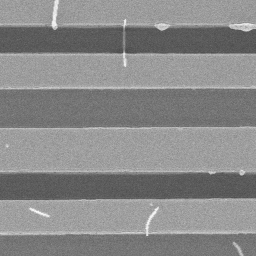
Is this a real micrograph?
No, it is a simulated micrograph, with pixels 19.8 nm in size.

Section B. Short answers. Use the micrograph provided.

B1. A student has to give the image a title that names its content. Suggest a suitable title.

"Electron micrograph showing lines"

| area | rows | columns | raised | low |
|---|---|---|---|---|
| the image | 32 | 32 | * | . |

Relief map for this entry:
********************************
********************************
********************************
....................*........***
................................
................................
................................
********************************
********************************
********************************
********************************
................................
................................
................................
................................
................................
********************************
********************************
********************************
********************************
********************************
..........................*...*.
................................
................................
................................
********************************
********************************
********************************
********************************
................................
................................
................................